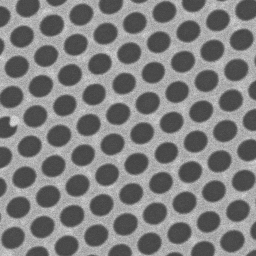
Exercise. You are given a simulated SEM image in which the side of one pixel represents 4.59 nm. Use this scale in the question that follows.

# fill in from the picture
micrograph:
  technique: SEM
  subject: a regular array of holes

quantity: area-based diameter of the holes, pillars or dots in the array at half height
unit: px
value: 22.3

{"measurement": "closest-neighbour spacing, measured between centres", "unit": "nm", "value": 141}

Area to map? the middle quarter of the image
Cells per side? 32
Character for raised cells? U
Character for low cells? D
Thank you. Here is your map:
UDDUUUDDDDDDUUUUUUUUDDDDDUUDDDDD
DDDDUUDDDDDUUUUUUUUUDDDDDUUUDDDU
DDDDUUUUDUUUUUDDUUUDDDDDDUUUUUUU
DDDDUUUUUUUUUDDDDDUUDDDDDUUUUUUU
DDDDUUUUUUUUDDDDDDUUUDDUUUUUDDUU
UUUUUUDDDDUUDDDDDDUUUUUUUUDDDDDU
UUUUUDDDDDUUDDDDDUUUUUUUUUDDDDDU
UUUUUDDDDDUUUUDUUUUUDDDUUDDDDDDU
DDDUUDDDDDUUUUUUUUDDDDDDUUDDDDUU
DDDUUDDDDUUUUUUUUUDDDDDDUUUDDUUU
DDDUUUUUUUUUDDDDUUDDDDDDUUUUUUUU
DDDUUUUUUUUDDDDDUUDDDDDUUUUUUUUD
DDUUUUUUUUUDDDDDDUUUDUUUUDDDDUUD
UUUUDDDDDUUDDDDDUUUUUUUUUDDDDDUU
UUUUDDDDDUUDDDDUUUUUUUUUDDDDDDUU
UUUDDDDDDUUUUUUUUUDDDDUUDDDDDUUU
DDUDDDDDDUUUUUUUUDDDDDUUUDDDDUUU
DDUUDDDUUUUUUUUUUDDDDDUUUUUUUUUD
DUUUUUUUUUDDDDDUUDDDDDUUUUUUUUDD
DUUUUUUUUDDDDDDUUUDDDUUUUUUUUUDD
UUUUDDDUUDDDDDDUUUUUUUUUDDDDUUDD
UUUDDDDUUDDDDDUUUUUUUUUDDDDDUUUD
UUDDDDDDUUUDDUUUUUDDUUUDDDDDUUUU
UUDDDDDDUUUUUUUUDDDDDUUDDDDDUUUU
UUDDDDDUUUUUUUUDDDDDDUUUDDUUUUUD
UUUUUUUUUDDDDUUDDDDDDUUUUUUUUDDD
UUUUUUUUDDDDDUUDDDDDUUUUUUUUUDDD
UUUUUUUUDDDDDDUUUDDUUUUDDDUUUDDD
UUDDDDUUDDDDDUUUUUUUUUDDDDDUUDDD
UDDDDDUUDDDDDUUUUUUUUDDDDDDUUUDD
DDDDDDUUUUUUUUUDDDDUUDDDDDDUUUUU
DDDDDDUUUUUUUUDDDDDDUUDDDDUUUUUU